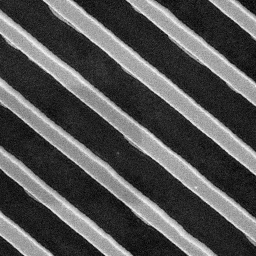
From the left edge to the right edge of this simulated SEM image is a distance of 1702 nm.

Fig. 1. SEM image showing lines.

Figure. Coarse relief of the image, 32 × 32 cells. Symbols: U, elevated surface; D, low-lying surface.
DDDDDDUUUDDDDDDDUUUUDDDDDDDUUUDD
DDDDDDDUUUUDDDDDDDUUUDDDDDDDUUUD
UDDDDDDDUUUUDDDDDDDUUUDDDDDDDUUU
UUDDDDDDDDUUUDDDDDDDUUUDDDDDDDUU
UUUUDDDDDDDUUUDDDDDDDUUUUDDDDDDD
DDUUUDDDDDDDUUUDDDDDDDUUUUDDDDDD
DDDUUUDDDDDDDUUUUDDDDDDDUUUDDDDD
DDDDUUUDDDDDDDUUUUDDDDDDDUUUDDDD
DDDDDUUUUDDDDDDDUUUDDDDDDDUUUUDD
DDDDDDDUUUDDDDDDDUUUDDDDDDDUUUUD
UDDDDDDDUUUDDDDDDDUUUUDDDDDDDUUU
UUDDDDDDDUUUDDDDDDDUUUUDDDDDDDUU
UUUDDDDDDDUUUUDDDDDDDUUUDDDDDDDU
DUUUDDDDDDDUUUUDDDDDDDUUUDDDDDDD
DDUUUDDDDDDDDUUUDDDDDDDUUUDDDDDD
DDDUUUUDDDDDDDUUUDDDDDDDUUUUDDDD
DDDDDUUUDDDDDDDUUUUDDDDDDUUUUDDD
DDDDDDUUUDDDDDDDUUUUDDDDDDDUUUDD
DDDDDDDUUUUDDDDDDUUUUDDDDDDDUUUD
UDDDDDDDUUUUDDDDDDDUUUDDDDDDDUUU
UUUDDDDDDDUUUDDDDDDDUUUDDDDDDDUU
DUUUDDDDDDDUUUDDDDDDDUUUUDDDDDDU
DDUUUDDDDDDDUUUDDDDDDDUUUUDDDDDD
DDDUUUDDDDDDDUUUUDDDDDDDUUUDDDDD
DDDDUUUDDDDDDDUUUUDDDDDDDUUUDDDD
DDDDDUUUUDDDDDDDUUUDDDDDDDUUUUDD
DDDDDDDUUUDDDDDDDUUUDDDDDDDUUUUD
UDDDDDDDUUUDDDDDDDUUUDDDDDDDUUUU
UUDDDDDDDUUUDDDDDDDUUUDDDDDDDDUU
UUUUDDDDDDUUUDDDDDDDDUUUDDDDDDDU
DUUUUDDDDDDUUUUDDDDDDDUUUDDDDDDD
DDDUUUDDDDDDDUUUDDDDDDDUUUDDDDDD